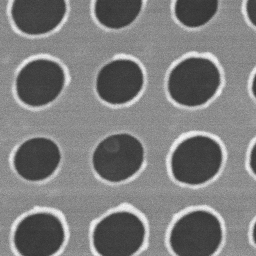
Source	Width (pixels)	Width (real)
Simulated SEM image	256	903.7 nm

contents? holes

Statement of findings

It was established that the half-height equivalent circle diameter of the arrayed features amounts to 0.17 µm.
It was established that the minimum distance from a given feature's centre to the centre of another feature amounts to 270 nanometers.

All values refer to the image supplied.